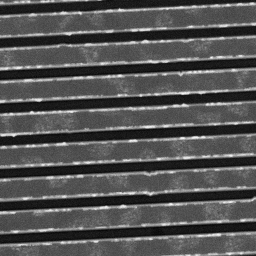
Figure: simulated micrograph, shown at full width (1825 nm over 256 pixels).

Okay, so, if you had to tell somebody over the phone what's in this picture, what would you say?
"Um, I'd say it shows parallel lines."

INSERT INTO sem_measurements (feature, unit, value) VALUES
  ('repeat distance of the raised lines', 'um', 0.233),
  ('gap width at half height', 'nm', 75.7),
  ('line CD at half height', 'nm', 158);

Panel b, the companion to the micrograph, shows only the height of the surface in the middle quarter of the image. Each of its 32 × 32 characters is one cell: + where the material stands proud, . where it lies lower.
++..............................
................................
...................+++++++++++++
++++++++++++++++++++++++++++++++
++++++++++++++++++++++++++++++++
++++++++++++++++++++++++++++++++
++++++++++++++++++++++++++++++++
++++++++++++++++++++++++++...++.
++++++..........................
................................
...........................+++++
........++++++++++++++++++++++++
++++++++++++++++++++++++++++++++
++++++++++++++++++++++++++++++++
++++++++++++++++++++++++++++++++
++++++++++++++++++++++++++++++..
++++++++++......................
................................
.............................+..
...........+++++++++++++++++++++
++++++++++++++++++++++++++++++++
++++++++++++++++++++++++++++++++
++++++++++++++++++++++++++++++++
++++++++++++++++++++++++++++++++
++++++++++++++..................
................................
...............................+
...........+++++++++++++++++++++
++++++++++++++++++++++++++++++++
++++++++++++++++++++++++++++++++
++++++++++++++++++++++++++++++++
++++++++++++++++++++++++++++++++